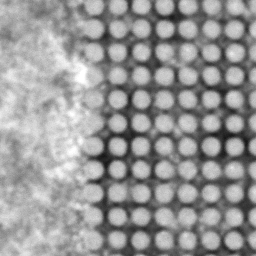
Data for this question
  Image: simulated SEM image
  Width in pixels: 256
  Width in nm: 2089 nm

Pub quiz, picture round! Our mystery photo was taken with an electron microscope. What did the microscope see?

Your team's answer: a regular array of raised bodies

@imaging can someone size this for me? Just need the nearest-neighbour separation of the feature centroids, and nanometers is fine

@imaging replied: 188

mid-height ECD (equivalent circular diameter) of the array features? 148 nanometres